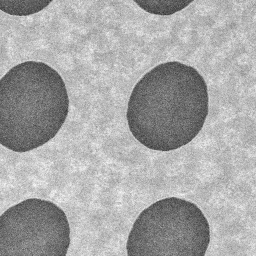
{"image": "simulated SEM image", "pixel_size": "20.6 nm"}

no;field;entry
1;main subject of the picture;holes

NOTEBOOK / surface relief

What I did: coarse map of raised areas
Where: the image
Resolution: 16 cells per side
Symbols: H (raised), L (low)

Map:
LLLHHHHHHLLHHHHH
HHHHHHHHHHHHHHHH
HHHHHHHHHHHHHHHH
HHHHHHHHHHHHHHHH
LLLLHHHHHLLLHHHH
LLLLHHHHLLLLLHHH
LLLLHHHHLLLLLHHH
LLLLHHHHLLLLLHHH
LLLHHHHHLLLLHHHH
HHHHHHHHHHHHHHHH
HHHHHHHHHHHHHHHH
HHHHHHHHHHHHHHHH
HHLHHHHHHHLLHHHH
LLLLHHHHHLLLLHHH
LLLLHHHHLLLLLHHH
LLLLHHHHLLLLLHHH